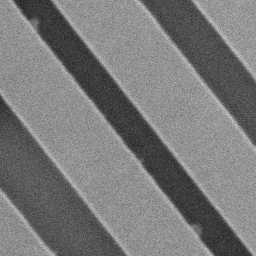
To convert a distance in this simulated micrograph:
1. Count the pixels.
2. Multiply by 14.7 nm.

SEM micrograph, lines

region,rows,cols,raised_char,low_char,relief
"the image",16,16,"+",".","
+...+++++...++++
++..++++++...+++
+++..++++++...++
+++...+++++....+
++++...+++++....
+++++...+++++...
.+++++..++++++..
.++++++..++++++.
..+++++...+++++.
...+++++...+++++
....+++++...++++
....++++++..++++
+....++++++..+++
+.....+++++...++
++.....+++++...+
+++.....+++++..+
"